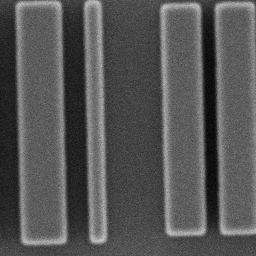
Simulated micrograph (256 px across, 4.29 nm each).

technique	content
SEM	groups of lines, slits or small figures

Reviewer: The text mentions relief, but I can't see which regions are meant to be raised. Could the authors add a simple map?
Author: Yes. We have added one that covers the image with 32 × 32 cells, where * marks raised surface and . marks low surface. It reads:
..******...**..........**..*****
..******...**.......*****..*****
..******...**.......*****..*****
..******...**.......*****..*****
..******...**.......*****..*****
..******...**.......*****..*****
..******...**.......*****..*****
..******...**.......*****..*****
..******...**.......*****..*****
..******...**.......*****..*****
..******...**.......*****..*****
..******...**.......*****..*****
..******...**.......*****..*****
..******...**.......*****..*****
..******...**.......*****..*****
..******...**........****..*****
..******...**........****..*****
..******...**........****..*****
..******...**........****..*****
...*****...**........*****.*****
...*****...**........*****.*****
...*****...**........*****.*****
...*****...**........*****.*****
...*****...**........*****.*****
...*****...**........*****.*****
...*****...**........*****..****
...*****...**........*****..****
...*****...**........*****..****
...*****...**........*****..****
...*****...**...................
...**...........................
................................